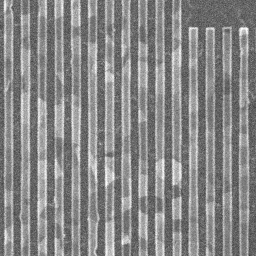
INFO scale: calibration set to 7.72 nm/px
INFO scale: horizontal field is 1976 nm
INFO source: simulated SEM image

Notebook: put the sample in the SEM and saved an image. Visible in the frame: parallel lines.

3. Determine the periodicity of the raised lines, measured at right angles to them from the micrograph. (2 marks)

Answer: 130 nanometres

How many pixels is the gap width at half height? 9.38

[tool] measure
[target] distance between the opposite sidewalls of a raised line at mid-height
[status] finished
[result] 58.9 nm